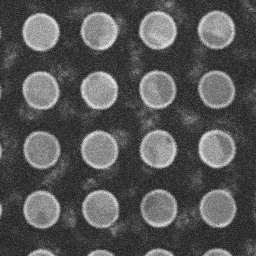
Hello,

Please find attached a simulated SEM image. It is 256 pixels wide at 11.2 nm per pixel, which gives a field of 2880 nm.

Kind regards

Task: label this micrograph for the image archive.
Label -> a regular array of raised bodies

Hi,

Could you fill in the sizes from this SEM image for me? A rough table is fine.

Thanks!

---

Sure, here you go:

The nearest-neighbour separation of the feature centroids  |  0.655 microns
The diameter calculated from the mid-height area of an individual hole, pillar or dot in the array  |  0.394 um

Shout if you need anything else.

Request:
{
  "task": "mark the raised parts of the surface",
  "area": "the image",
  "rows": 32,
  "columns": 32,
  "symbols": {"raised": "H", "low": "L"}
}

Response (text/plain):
LLLLLLLLLLLLLLLLLLLLLLLLLLLLLLLL
LLLLLLLLLLLLLLLLLLLLLLLLLLLLLLLL
LLLLHHHLLLLHHHLLLLHHHLLLLHHHHLLL
LLLHHHHLLLHHHHLLLLHHHHLLLHHHHLLL
LLLHHHHLLLHHHHLLLLHHHHLLLHHHHLLL
LLLLHHHLLLLHHHLLLLHHHLLLLLHHLLLL
LLLLLLLLLLLLLLLLLLLLLLLLLLLLLLLL
LLLLLLLLLLLLLLLLLLLLLLLLLLLLLLLL
LLLLLLLLLLLLLLLLLLLLLLLLLLLLLLLL
LLLLHHLLLLLHHHLLLLHHHLLLLLHHLLLL
LLLHHHHLLLHHHHLLLLHHHHLLLHHHHLLL
LLLHHHHLLLHHHHHLLLHHHHLLLHHHHLLL
LLLHHHHLLLLHHHLLLLHHHLLLLLHHHLLL
LLLLLLLLLLLLLLLLLLLLLLLLLLLLLLLL
LLLLLLLLLLLLLLLLLLLLLLLLLLLLLLLL
LLLLLLLLLLLLLLLLLLLLLLLLLLLLLLLL
LLLLLLLLLLLLLLLLLLLLLLLLLLHLLLLL
LLLHHHHLLLLHHHLLLLHHHHLLLHHHHLLL
LLLHHHHLLLHHHHHLLLHHHHLLLHHHHLLL
LLLHHHHLLLHHHHLLLLHHHHLLLHHHHLLL
LLLLHHLLLLLHHHLLLLLHHLLLLLHHLLLL
LLLLLLLLLLLLLLLLLLLLLLLLLLLLLLLL
LLLLLLLLLLLLLLLLLLLLLLLLLLLLLLLL
LLLLLLLLLLLLLLLLLLLLLLLLLLLLLLLL
LLLLHHLLLLLHHHLLLLHHHLLLLLHHHLLL
LLLHHHHLLLLHHHHLLLHHHHLLLHHHHLLL
LLLHHHHLLLLHHHHLLLHHHHLLLHHHHLLL
LLLLHHHLLLLHHHLLLLHHHLLLLLHHHLLL
LLLLLLLLLLLLLLLLLLLLLLLLLLLLLLLL
LLLLLLLLLLLLLLLLLLLLLLLLLLLLLLLL
LLLLLLLLLLLLLLLLLLLLLLLLLLLLLLLL
LLLLLHLLLLLLHLLLLLLHHLLLLLHHLLLL